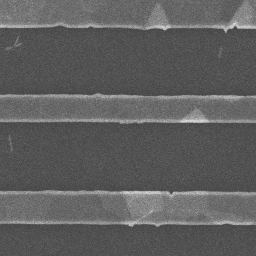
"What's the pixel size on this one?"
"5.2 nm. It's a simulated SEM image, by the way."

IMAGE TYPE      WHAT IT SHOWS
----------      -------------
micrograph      one or a few lines or trenches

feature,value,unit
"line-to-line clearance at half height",0.366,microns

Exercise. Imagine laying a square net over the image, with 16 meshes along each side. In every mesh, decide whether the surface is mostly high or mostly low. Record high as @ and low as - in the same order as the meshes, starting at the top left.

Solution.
@@@@@@@@@@@@@@@@
@@@@@@@@@@@@@@@@
----------------
----------------
----------------
----------------
@@@@@@@@@@@@@@@@
@@@@---@@@@@@@@@
----------------
----------------
----------------
----------------
@@@@@@@@@@@@@@@@
@@@@@@@@@@@@@@@@
----------------
----------------